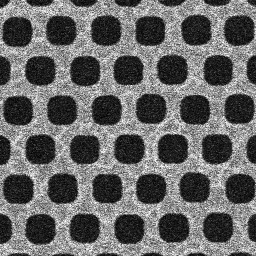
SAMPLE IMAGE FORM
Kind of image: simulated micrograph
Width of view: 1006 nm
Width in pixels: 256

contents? a regular array of holes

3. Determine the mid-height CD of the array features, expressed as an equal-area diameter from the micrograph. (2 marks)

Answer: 0.125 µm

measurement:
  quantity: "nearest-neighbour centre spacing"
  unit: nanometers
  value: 174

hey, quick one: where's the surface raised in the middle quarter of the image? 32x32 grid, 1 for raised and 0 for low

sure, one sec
10000000011100000000111000000001
10000000011100000000111000000001
10000000011100000000111000000001
10000000011100000000111100000001
11000000011110000001111100000011
11100001111111111111111111111111
11111111111111111111111111111111
11111111111111111111000111111111
00011111000000111110000001111100
00011110000000111100000001111000
00011110000000111100000000111000
00011110000000011100000000111000
00011110000000011100000001111000
00011110000000111100000001111000
00111110000000111110000011111100
11111111111111111111111111111111
11111111111111111111111111111111
11111111111111111111111110000111
11000000111110000001111100000011
11000000011110000000111100000001
10000000011100000000111000000001
10000000011100000000111000000001
10000000011100000000111000000001
11000000011110000000111100000001
11100000111111000001111100000011
11111111111111111111111111111111
11111111111111111111111111111111
00111111100001111111100111111100
00011111000000111110000001111000
00011110000000111100000001111000
00011110000000011100000000111000
00001110000000011100000000111000